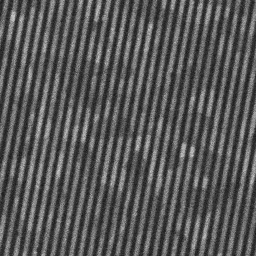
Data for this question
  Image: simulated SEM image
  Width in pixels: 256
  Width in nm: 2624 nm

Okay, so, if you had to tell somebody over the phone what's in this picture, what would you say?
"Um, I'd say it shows parallel lines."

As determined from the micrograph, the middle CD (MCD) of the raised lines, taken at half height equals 3.56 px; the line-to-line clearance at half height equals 0.058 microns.